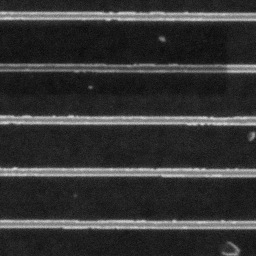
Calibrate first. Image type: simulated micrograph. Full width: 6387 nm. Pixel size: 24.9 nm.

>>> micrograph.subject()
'lines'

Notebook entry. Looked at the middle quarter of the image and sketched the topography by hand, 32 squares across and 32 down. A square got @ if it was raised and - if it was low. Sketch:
@@@@@@@@@@@@@@@@@@@@@@@@@@@@@@@@
@@@@@@@@@@@@@@@@@@@@@@@@@@@@@@@@
--------------------------------
--------------------------------
--------------------------------
--------------------------------
--------------------------------
--------------------------------
--------------------------------
--------------------------------
--------------------------------
--------------------------------
--------------------------------
@@@@@@@@@@@@@@@@@@@@@@@@@@@@@@@@
@@@@@@@@@@@@@@@@@@@@@@@@@@@@@@@@
--------------------------------
--------------------------------
--------------------------------
--------------------------------
--------------------------------
--------------------------------
--------------------------------
--------------------------------
--------------------------------
--------------------------------
--------------------------------
@@@@@@@@@@@@@@@@@@@@@@-@@@@@@@@@
@@@@@@@@@@@@@@@@@@@@@@@@@@@@@@@@
--------------------------------
--------------------------------
--------------------------------
--------------------------------